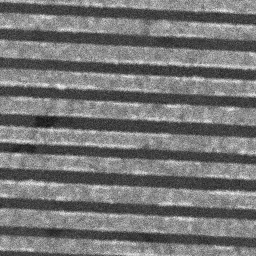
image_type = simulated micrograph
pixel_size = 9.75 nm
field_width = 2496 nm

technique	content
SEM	parallel lines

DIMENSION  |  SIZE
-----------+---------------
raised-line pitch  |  0.272 microns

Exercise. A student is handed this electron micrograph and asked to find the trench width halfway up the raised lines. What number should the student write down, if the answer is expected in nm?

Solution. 112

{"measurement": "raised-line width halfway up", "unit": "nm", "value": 161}